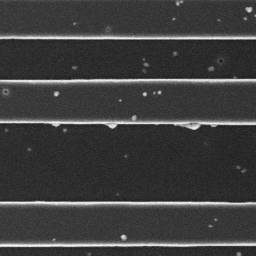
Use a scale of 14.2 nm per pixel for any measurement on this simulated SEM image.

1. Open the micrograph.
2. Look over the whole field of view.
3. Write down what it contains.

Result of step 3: lines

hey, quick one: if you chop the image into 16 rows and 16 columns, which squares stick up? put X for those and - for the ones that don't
XXXXXXXXXXXXXXXX
XXXXXXXXXXXXXXXX
----------------
----------------
----------------
XXXXXXXXXXXXXXXX
XXXXXXXXXXXXXXXX
XXXXXXXXXXXXXXXX
----------------
----------------
----------------
----------------
----------------
XXXXXXXXXXXXXXXX
XXXXXXXXXXXXXXXX
----------------